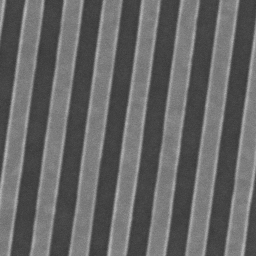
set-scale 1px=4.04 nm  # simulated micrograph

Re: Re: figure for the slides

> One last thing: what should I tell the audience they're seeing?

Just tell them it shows parallel lines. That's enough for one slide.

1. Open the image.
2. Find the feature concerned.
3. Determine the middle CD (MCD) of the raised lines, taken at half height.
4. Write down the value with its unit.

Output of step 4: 71.1 nm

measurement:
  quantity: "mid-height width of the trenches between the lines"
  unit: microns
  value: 0.0856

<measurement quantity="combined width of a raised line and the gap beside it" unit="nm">156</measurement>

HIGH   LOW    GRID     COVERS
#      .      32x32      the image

...##...##...##...##...##..###..
...##...##...##...##..###..###..
...##...##...##...##..###..##...
...##...##...##..###..##...##...
...##..###..###..##...##...##...
..###..###..##...##...##...##...
..###..##...##...##...##...##...
..##...##...##...##...##...##..#
..##...##...##...##...##..###..#
..##...##...##...##..###..##...#
..##...##...##..###..##...##...#
..##...##..###..##...##...##...#
..##..###..###..##...##...##...#
..##..##...##...##...##...##...#
.##...##...##...##...##...##...#
.##...##...##...##...##..###..##
.##...##...##...##...##..###..##
.##...##...##..###..###..##...##
.##...##...##..###..##...##...##
.##..###..###..##...##...##...##
.##..###..##...##...##...##...##
###..##...##...##...##...##...##
##...##...##...##...##...##..###
##...##...##...##...##..###..###
##...##...##...##..###..##...##.
##...##...##..###..##...##...##.
##...##...##..##...##...##...##.
##..###..###..##...##...##...##.
##..##...##...##...##...##...##.
#...##...##...##...##...##..###.
#...##...##...##...##..###..###.
#...##...##...##..###..###..##..